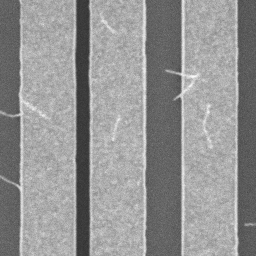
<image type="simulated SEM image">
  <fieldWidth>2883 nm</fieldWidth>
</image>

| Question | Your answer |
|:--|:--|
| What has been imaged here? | lines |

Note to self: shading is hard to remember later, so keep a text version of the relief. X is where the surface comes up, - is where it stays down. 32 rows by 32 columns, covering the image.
---XXXXXX--XXXXXXX-----XXXXXXX--
---XXXXXX--XXXXXXX-----XXXXXXX--
---XXXXXX--XXXXXXX-----XXXXXXX--
---XXXXXX--XXXXXXX-----XXXXXXX--
---XXXXXX--XXXXXXX-----XXXXXXX--
---XXXXXX--XXXXXXX-----XXXXXXX--
---XXXXXX--XXXXXXX-----XXXXXXX--
---XXXXXX--XXXXXXX-----XXXXXXX--
---XXXXXX--XXXXXXX-----XXXXXXX--
---XXXXXX--XXXXXXX-----XXXXXXX--
---XXXXXX--XXXXXXX-----XXXXXXX--
--XXXXXXX--XXXXXXX-----XXXXXXX--
--XXXXXXX--XXXXXXX-----XXXXXXX--
---XXXXXX--XXXXXXX-----XXXXXXX--
---XXXXXX--XXXXXXX-----XXXXXXX--
---XXXXXX--XXXXXXX-----XXXXXXX--
---XXXXXX--XXXXXXX-----XXXXXXX--
---XXXXXX--XXXXXXX-----XXXXXXX--
---XXXXXX--XXXXXXX-----XXXXXXX--
---XXXXXX--XXXXXXX-----XXXXXXX--
---XXXXXX--XXXXXXX-----XXXXXXX--
---XXXXXX--XXXXXXX-----XXXXXXX--
---XXXXXX--XXXXXXX-----XXXXXXX--
---XXXXXX--XXXXXXX-----XXXXXXX--
---XXXXXX--XXXXXXX-----XXXXXXX--
---XXXXXX--XXXXXXX-----XXXXXXX--
---XXXXXX--XXXXXXX-----XXXXXXX--
---XXXXXX--XXXXXXX-----XXXXXXX--
---XXXXXX--XXXXXXX-----XXXXXXX--
---XXXXXX--XXXXXXX-----XXXXXXX--
---XXXXXX--XXXXXXX-----XXXXXXX--
---XXXXXX--XXXXXXX-----XXXXXXX--